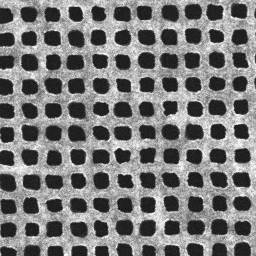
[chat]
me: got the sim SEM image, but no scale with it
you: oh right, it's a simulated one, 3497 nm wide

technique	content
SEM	a regular array of holes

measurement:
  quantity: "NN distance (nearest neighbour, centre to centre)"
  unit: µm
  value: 0.312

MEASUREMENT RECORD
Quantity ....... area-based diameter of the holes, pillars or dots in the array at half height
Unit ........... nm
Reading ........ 225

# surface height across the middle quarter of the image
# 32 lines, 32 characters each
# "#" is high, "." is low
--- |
#....##....##....##....##...##..
################################
################################
########..##########..###...###.
#....##....##....##....#....##..
#....##....##....##....#.....#..
#....###...##....##...###...###.
#########.######################
################################
########..####.#####.####...###.
#....##....##....##...###....##.
#....##....#.....##....##....##.
#....###...##....##....##...###.
################################
################################
##.#####..###..####...###...###.
#....##....##....##....##....#..
#....##....##....##....##....#..
#.....##...##....##....##...###.
################################
################################
##...###.####...###....##...###.
#.....#....##....##....##....#..
#....##.....#....##....##....#..
##...##....##...###....##....##.
################################
################################
##...###...###.####...###...###.
##...##....##....##....##....##.
##....#....##....##....##....##.
##...###...###...##....##....###
################################